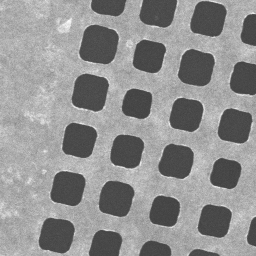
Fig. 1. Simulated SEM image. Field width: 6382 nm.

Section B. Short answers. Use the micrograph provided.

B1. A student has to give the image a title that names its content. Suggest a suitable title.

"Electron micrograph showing a regular array of holes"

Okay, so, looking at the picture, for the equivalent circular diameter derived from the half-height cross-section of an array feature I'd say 879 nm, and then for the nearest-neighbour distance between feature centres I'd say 1210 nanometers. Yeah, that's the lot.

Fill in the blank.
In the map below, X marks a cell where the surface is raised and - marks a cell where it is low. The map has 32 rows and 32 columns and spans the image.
XXXXXXXXXXX-----XX----XXX---XXXX
XXXXXXXXXXXX---XX-----XX----XXXX
XXXXXXXXXXXXXXXXXX----XX----XX--
XXXXXXXXXXX---XXXXXXXXXX----XX--
XXXXXXXXXX-----XXXXXXXXXXX-XXX--
XXXXXXXXXX-----XX---XXXXXXXXXXX-
XXXXXXXXXX-----XX----XX--XXXXXXX
XXXXXXXXXXX---XXX---XXX----XXXXX
XXXXXXXXXXXXXXXXX---XX-----XX---
XXXXXXXXXX--XXXXXXXXXX----XXX---
XXXXXXXXX-----XXXXXXXXX---XXX---
XXXXXXXXX----XXX---XXXXXXXXXX---
XXXXXXXXX----XX----XXX--XXXXXXXX
XXXXXXXXXX---XX----XX----XXXXXXX
XXXXXXXXXXXXXXXX--XXX----XXX---X
XXXXXXXXX-XXXXXXXXXXX----XX----X
XXXXXXXX----XXXXXXXXXXXXXXX----X
XXXXXXXX----XX----XXXXXXXXXX---X
XXXXXXXX----XX----XXX---XXXXXXXX
XXXXXXXXX--XXX----XX----XXXXXXXX
XXXXXXXXXXXXXX---XXX----XXX---XX
XXXXXXX--XXXXXXXXXXX----XX----XX
XXXXXXX----XXXXXXXXXXXXXXX----XX
XXXXXX-----XX----XXXXXXXXXXX-XXX
XXXXXX----XX-----XXXXXXXXXXXXXXX
XXXXXXXX--XX----XXX---XXXXXXXXXX
XXXXXXXXXXXXX---XXX---XXX----XXX
XXXXXX--XXXXXXXXXXX---XXX----XXX
XXXXX----XXXXXXXXXXXXXXXX----XX-
XXXXX----XXX---XXXXXXXXXXX--XXX-
XXXXX----XX----XXX---XXXXXXXXXX-
XXXXXXX-XXX----XXX---XXX---XXXXX